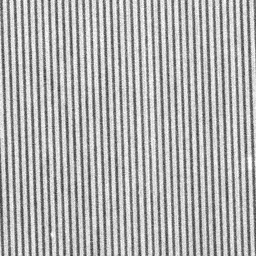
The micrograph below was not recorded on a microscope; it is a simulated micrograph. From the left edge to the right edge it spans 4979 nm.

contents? parallel lines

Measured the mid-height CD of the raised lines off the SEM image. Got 65.6 nm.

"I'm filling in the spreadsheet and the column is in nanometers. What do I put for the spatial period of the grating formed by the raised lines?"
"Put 133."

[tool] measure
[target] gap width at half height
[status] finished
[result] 68 nanometres